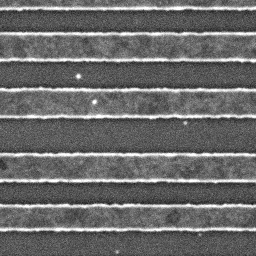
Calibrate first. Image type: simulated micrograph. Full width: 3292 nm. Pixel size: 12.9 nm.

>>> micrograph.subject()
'lines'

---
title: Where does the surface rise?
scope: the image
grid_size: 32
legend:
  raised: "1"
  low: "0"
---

11111111111111111111111111111111
00000000000000000000000000000000
00000000000000000000000000000000
00000000000000000000000000000000
11111111111111111111111111111111
11111111111111111111111111111111
11111111111111111111111111111111
11111111111111111111111111111111
00000000000000000000000000000000
00000000000000000000000000000000
00000000000000000000000000000000
11111111111111111111111111111111
11111111111111111111111111111111
11111111111111111111111111111111
11111111111111111111111111111111
00000000000000000000000000000000
00000000000000000000000000000000
00000000000000000000000000000000
00000000000000000000000000000000
11111111111111111111111111111111
11111111111111111111111111111111
11111111111111111111111111111111
11111111111111111111111111111111
00000000000000000000000000000000
00000000000000000000000000000000
00000000000000000000000000000000
11111111111111111111111111111111
11111111111111111111111111111111
11111111111111111111111111111111
00000000000000000000000000000000
00000000000000000000000000000000
00000000000000000000000000000000